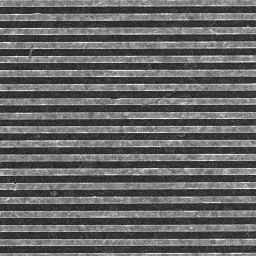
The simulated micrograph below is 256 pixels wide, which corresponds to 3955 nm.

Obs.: parallel lines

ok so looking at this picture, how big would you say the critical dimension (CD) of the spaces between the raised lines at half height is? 120 nanometres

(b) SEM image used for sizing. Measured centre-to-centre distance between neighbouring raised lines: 218 nm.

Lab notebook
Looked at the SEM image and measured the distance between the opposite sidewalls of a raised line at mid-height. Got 6.38 px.